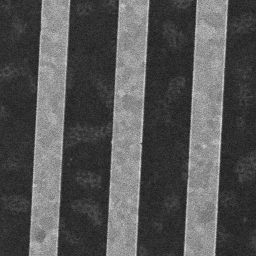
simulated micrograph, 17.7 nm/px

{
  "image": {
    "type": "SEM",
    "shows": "one or a few lines or trenches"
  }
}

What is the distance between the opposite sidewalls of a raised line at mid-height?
516 nm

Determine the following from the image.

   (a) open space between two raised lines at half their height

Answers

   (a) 868 nm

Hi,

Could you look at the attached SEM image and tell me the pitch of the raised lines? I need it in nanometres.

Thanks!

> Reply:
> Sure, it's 1380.